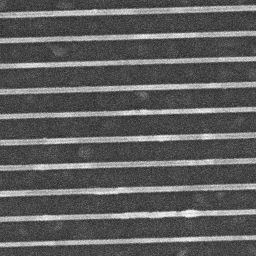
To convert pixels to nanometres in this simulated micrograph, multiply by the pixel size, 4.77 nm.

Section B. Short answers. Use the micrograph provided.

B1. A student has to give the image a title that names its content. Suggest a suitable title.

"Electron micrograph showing parallel lines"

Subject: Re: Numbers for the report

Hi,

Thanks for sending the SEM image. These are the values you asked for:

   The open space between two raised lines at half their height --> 104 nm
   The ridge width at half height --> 0.0197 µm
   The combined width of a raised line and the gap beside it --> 122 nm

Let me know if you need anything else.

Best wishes